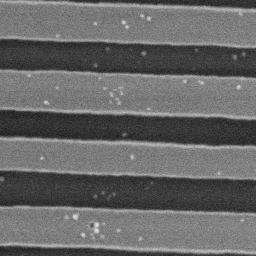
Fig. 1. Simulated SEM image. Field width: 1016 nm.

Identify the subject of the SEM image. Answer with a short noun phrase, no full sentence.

lines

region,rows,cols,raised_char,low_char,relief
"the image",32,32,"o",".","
ooooooooooo.o...................
oooooooooooooooooooooooooooooooo
oooooooooooooooooooooooooooooooo
oooooooooooooooooooooooooooooooo
oooooooooooooooooooooooooooooooo
.....................ooooooooooo
................................
................................
................................
ooooooooooooooooooooooooo.......
oooooooooooooooooooooooooooooooo
oooooooooooooooooooooooooooooooo
oooooooooooooooooooooooooooooooo
oooooooooooooooooooooooooooooooo
.........................ooooooo
................................
................................
oooooooo........................
oooooooooooooooooooooooooooooooo
oooooooooooooooooooooooooooooooo
oooooooooooooooooooooooooooooooo
.......ooooooooooooooooooooooooo
................................
................................
................................
................................
oooooooooooooooooooooooo........
oooooooooooooooooooooooooooooooo
oooooooooooooooooooooooooooooooo
oooooooooooooooooooooooooooooooo
oooooooooooooooooooooooooooooooo
.........................o...ooo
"